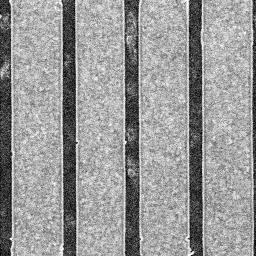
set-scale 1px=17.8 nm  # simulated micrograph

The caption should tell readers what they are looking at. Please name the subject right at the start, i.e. parallel lines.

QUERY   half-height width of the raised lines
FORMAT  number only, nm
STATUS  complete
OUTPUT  893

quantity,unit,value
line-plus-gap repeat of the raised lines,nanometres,1130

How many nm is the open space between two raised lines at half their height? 253